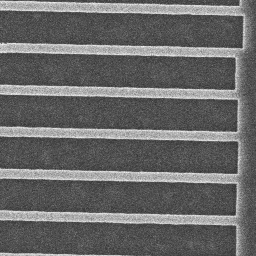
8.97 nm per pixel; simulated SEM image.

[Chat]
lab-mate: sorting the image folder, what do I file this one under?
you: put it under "parallel lines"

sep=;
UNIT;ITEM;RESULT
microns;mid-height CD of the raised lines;0.0807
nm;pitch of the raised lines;377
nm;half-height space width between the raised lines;290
